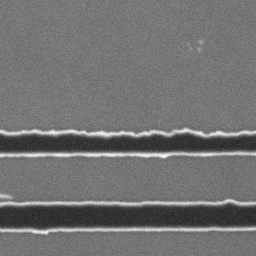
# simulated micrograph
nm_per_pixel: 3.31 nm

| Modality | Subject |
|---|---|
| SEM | one or a few lines or trenches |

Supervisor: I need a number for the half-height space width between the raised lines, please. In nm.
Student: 155